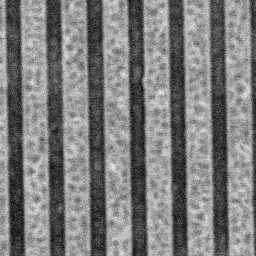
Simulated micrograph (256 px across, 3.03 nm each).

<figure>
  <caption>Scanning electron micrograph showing parallel lines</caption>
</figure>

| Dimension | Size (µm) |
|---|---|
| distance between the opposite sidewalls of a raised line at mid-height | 0.0711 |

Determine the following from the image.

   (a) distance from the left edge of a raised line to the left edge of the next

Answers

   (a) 124 nanometres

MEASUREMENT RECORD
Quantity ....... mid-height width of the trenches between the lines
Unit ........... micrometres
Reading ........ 0.0533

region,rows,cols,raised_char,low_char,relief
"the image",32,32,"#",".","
#..###..###..###..###..###..###.
#..###..###..###..###..###..###.
#..###..###..###..###..###..###.
#..###..###..###..###..###..###.
#..###..###..###..###..###..###.
...###..###..###..###..###..###.
#..###..###..###..###..###..###.
#..###..###..###..###..###..###.
#..###..###..###..###..###..###.
#..###..###..###..###..###..###.
#..###..###..###..###..###..###.
#..###..###..###..###..###...##.
#..###..###..###..###..###...##.
#..###..###..###..###..###...##.
#..###..###..###..###..###...##.
#..###..###..###..###..###...##.
#..###..###..###..###..###...##.
#..###..###..###..###..###...##.
#..###..###..###..###..###...##.
#..###..###..###..###..###...##.
#..###..###..###..###...##...##.
#..###..###..###...##...##...##.
#..###..###..###...##...##...##.
#..###..###..###...##...##...##.
#..###..###..###...##...##...##.
#..###..###..###...##...##...##.
#..###..###..###...##...##...##.
#..###..###..###...##...##...##.
#..###..###..###...##...##...###
#..###..###..###...##...###..###
#..###..###...##...##...###..###
#..###..###...##...##...###..###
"